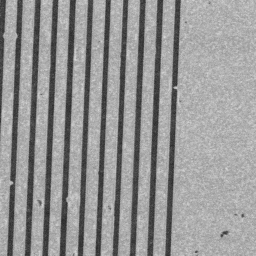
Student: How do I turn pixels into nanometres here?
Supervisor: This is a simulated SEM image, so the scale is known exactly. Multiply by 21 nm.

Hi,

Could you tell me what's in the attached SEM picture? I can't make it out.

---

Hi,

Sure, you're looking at parallel lines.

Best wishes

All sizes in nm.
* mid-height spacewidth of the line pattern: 129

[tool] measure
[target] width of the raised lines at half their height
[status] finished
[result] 239 nm